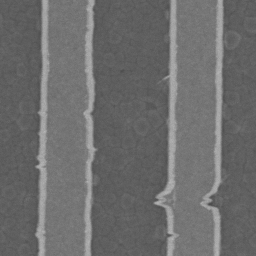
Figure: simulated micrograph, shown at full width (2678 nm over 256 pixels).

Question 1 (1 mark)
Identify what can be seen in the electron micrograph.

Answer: one or a few lines or trenches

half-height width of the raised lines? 492 nanometers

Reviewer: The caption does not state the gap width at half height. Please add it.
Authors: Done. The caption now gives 852 nm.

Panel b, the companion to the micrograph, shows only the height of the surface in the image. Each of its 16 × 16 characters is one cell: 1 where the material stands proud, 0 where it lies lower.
0001110000011100
0001110000011100
0001110000011100
0001110000011100
0001110000011100
0001110000011100
0001110000011100
0001110000011100
0001110000011100
0001110000011100
0001110000011100
0001110000011100
0001110000111000
0001110000011100
0001110000011100
0001110000011100